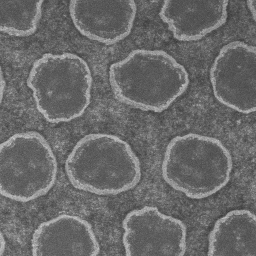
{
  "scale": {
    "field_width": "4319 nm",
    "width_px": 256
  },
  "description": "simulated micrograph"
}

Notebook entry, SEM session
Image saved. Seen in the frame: raised bodies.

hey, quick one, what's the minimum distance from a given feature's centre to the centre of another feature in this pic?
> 1490 nanometers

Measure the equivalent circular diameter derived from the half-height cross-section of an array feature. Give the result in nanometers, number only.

1050